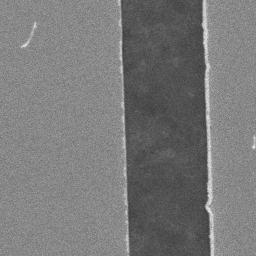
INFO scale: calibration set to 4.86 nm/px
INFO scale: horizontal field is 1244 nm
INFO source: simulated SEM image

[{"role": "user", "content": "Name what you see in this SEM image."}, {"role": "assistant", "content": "one or a few lines or trenches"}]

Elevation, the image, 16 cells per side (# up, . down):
########.....###
########.....###
########.....###
########.....###
########.....###
########.....###
########.....###
########.....###
########.....###
########.....###
########.....###
########.....###
########.....###
########.....###
########.....###
########.....###